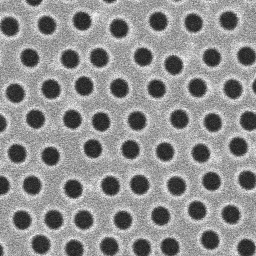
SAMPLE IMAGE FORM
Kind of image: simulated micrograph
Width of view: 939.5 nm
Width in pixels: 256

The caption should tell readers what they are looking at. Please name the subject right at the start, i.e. a regular array of holes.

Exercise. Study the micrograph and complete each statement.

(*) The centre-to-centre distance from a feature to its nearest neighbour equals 0.12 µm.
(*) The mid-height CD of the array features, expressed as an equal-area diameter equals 19.4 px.